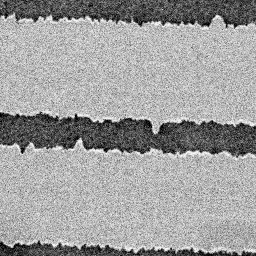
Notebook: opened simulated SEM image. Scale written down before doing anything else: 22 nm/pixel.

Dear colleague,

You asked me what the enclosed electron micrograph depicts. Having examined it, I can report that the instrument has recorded one or a few lines or trenches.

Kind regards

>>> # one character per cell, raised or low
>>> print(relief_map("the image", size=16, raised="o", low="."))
................
oooooooo.o...o..
oooooooooooooooo
oooooooooooooooo
oooooooooooooooo
oooooooooooooooo
oooooooooooooooo
.........ooooooo
................
oooooooo........
oooooooooooooooo
oooooooooooooooo
oooooooooooooooo
oooooooooooooooo
oooooooooooooooo
........o.oooooo